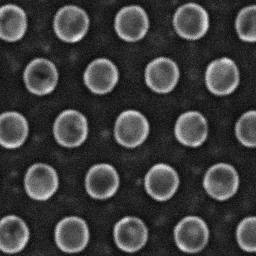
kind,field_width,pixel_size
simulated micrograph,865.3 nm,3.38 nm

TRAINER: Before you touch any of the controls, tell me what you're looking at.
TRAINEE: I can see a regular array of raised bodies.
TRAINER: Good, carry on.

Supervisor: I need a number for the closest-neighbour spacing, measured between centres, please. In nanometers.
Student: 202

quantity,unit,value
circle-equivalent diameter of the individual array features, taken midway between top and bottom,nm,113